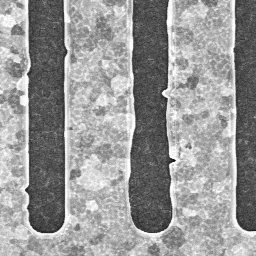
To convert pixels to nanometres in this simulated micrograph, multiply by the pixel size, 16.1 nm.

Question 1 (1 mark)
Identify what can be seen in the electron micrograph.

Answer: one or a few lines or trenches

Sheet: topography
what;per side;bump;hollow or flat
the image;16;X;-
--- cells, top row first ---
XX--XXXX---XXXX-
XX--XXXX---XXXX-
XX--XXXX---XXXX-
XX--XXXX---XXXX-
XX--XXXX---XXXX-
XX--XXXX--XXXXX-
XX--XXXX--XXXXX-
XX--XXXX--XXXXX-
XX--XXXX---XXXX-
XX--XXXX---XXXX-
XX--XXXX---XXXX-
XX--XXXX---XXXX-
XX--XXXX---XXXX-
XX--XXXX---XXXX-
XX-XXXXXX-XXXXXX
XXXXXXXXXXXXXXXX